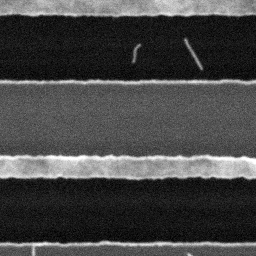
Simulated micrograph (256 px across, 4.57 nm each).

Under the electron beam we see lines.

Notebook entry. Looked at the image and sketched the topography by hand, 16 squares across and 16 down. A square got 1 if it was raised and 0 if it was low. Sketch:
1111111111111111
0000000000000000
0000000000000000
0000000000000000
0000000000000000
1111111111111111
1111111111111111
1111111111111111
1111111111111111
1111111111111111
1111111111111111
0000000000000000
0000000000000000
0000000000000000
0000000000000000
1111111111111111